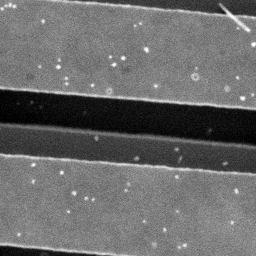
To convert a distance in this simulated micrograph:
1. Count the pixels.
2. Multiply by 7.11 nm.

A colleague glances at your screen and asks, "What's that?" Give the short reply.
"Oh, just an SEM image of lines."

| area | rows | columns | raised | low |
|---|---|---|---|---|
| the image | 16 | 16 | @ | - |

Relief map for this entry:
@@@@@@@@@-------
@@@@@@@@@@@@@@@@
@@@@@@@@@@@@@@@@
@@@@@@@@@@@@@@@@
@@@@@@@@@@@@@@@@
@@@@@@@@@@@@@@@@
------------@@@@
----------------
----------------
----------------
@@@@@@@@@@@-----
@@@@@@@@@@@@@@@@
@@@@@@@@@@@@@@@@
@@@@@@@@@@@@@@@@
@@@@@@@@@@@@@@@@
--@@@@@@@@@@@@@@